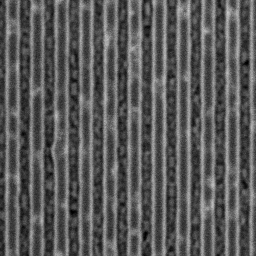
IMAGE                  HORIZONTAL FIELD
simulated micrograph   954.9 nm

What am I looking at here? parallel lines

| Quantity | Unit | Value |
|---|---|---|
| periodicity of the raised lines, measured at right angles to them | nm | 91.2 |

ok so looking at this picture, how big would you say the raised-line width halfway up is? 12.9 px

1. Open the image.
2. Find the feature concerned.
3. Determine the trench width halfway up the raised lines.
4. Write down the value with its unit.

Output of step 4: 44.8 nm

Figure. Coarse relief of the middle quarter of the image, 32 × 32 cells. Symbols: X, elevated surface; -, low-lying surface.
X---XXX---XXX---XXX---XXX---XXX-
X---XXX---XXX---XXX---XXX---XXX-
X---XXX---XXX---XXX---XXX---XXX-
X---XXX---XXX---XXX---XXX---XXX-
X---XXX---XXX---XXX---XXX---XXX-
X---XXX---XXX---XXX---XXX---XXX-
X-X-XXX---XXX---XXX---XXX---XXX-
X---XXX---XXX---XXX---XXX---XXX-
X---XXX---XXX---XXX---XXX---XXX-
X---XXX---XXX---XXX---XXX---XXX-
X---XXX---XXX---XXX---XXX---XXX-
X---XXX---XXX---XXX---XXX---XXX-
X---XXX---XXX---XXX---XXX---XXX-
X---XXX---XXX---XXX---XXX---XXX-
X---XXX---XXX---XXX---XXX---XXX-
X---XXX---XXX---XXX---XXX---XXX-
X---XXX---XXX---XXX---XXX---XXX-
X---XXX---XXX---XXX---XXX---XXX-
X---XXX---XXX---XXX---XXX---XXX-
X---XXX---XXX---XXX---XXX---XXX-
X---XXX---XXX---XXX---XXX---XXX-
X---XXX---XXX---XXX---XXX---XXX-
X---XXX---XXX---XXX---XXX---XXX-
X---XXX---XXX---XXX---XXX---XXX-
X---XXX---XXX---XXX---XXX---XXX-
X---XXX---XXX---XXX---XXX---XXX-
X---XXX---XXX---XXX---XXX---XXX-
X---XXX---XXX---XXX---XXX---XXX-
X---XXX---XXX---XXX---XXX---XXX-
X---XXX---XXX---XXX---XXX---XXX-
X---XXX---XXX---XXX---XXX---XXX-
X---XXX---XXX---XXX---XXX---XXX-